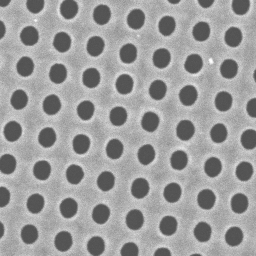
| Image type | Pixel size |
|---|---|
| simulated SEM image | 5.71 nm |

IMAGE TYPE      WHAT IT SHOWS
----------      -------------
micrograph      a regular array of holes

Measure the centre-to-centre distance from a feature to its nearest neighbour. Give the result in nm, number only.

183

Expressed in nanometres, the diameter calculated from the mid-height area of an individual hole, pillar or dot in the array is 112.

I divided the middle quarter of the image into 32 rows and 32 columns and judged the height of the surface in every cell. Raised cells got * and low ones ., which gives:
***********************...****..
.****...**********************..
.****....******.****************
.****....****....***************
*****....****....*****...*******
*****...*****....****.....****..
*************....****.....***...
**************..*****.....***...
**********************...****...
****...**********************...
***.....**********************..
***.....****....****************
***....****.....****...*********
****...****.....***.....********
************...****.....*****...
*************.*****.....****....
********************...*****....
****************************....
**....***********************...
**.....****...******************
**.....****....****...**********
**....****.....****....*********
***..******....***.....****....*
***********...****.....****....*
*******************...*****....*
*...***********************....*
*....***********************.***
.....****...********************
*....***.....*****..************
*...****.....****....***********
********.....****....****....***
*********...*****....****....***